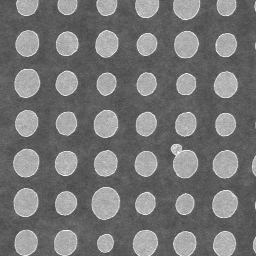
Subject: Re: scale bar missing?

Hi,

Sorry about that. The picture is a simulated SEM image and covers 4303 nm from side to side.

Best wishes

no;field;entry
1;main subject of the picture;a regular array of raised bodies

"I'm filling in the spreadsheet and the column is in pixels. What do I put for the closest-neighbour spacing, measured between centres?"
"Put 39.6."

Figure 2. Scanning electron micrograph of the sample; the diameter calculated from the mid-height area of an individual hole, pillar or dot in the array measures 393 nanometres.